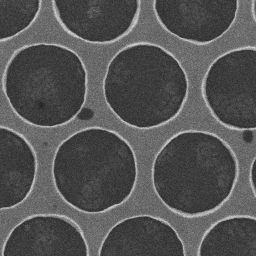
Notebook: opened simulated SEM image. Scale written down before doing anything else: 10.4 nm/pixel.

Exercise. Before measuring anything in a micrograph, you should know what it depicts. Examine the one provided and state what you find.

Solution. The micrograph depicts holes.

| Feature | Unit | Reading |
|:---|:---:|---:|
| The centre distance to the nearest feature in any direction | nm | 1020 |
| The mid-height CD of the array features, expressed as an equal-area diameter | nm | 852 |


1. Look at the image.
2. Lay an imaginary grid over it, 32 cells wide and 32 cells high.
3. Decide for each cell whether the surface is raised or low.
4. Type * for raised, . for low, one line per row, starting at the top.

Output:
.....**..........**...........**
.....**..........***..........**
....****.........***.........***
...*****........*****........***
.*********.....*******.....*****
********************************
**.......******......********...
*.........****........*****.....
*.........****.........***......
*..........**..........***......
*..........**..........***......
*..........**..........***......
*.........***..........***......
**........****........****......
***......******.......*****.....
****....********....********....
..********....**********.*******
...*****.......*******......****
....***.........****.........***
....***..........***.........***
.....**..........**...........**
....***..........**...........*.
....***..........**..........**.
....***.........***..........***
...*****........****........****
..*******......******......*****
***********.**********...*******
****.....*******....********....
**........****.......******.....
*.........***.........****......
*..........**..........**.......
...........**..........**.......